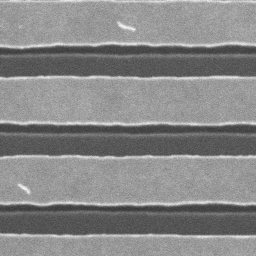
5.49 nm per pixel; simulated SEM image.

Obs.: lines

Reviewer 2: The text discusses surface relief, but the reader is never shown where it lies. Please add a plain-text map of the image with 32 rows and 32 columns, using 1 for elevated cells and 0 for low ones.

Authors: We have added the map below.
11111111111111111111111111111111
11111111111111111111111111111111
11111111111111111111111111111111
11111111111111111111111111111111
11111111111111111111111111111111
11111111111110011111111111110011
00000000000000000000000000000000
00000000000000000000000000000000
00000000000000000000000000000000
00000000000000000000000000000000
11111111111111111111111111111111
11111111111111111111111111111111
11111111111111111111111111111111
11111111111111111111111111111111
11111111111111111111111111111111
00000000000001111100000111110000
00000000000000000000000000000000
00000000000000000000000000000000
00000000000000000000000000000000
01111101111000000010011110011111
11111111111111111111111111111111
11111111111111111111111111111111
11111111111111111111111111111111
11111111111111111111111111111111
11111111111111111111111111111111
11001110011111111111111000000111
00000000000000000000000000000000
00000000000000000000000000000000
00000000000000000000000000000000
11111111101111111111111000000000
11111111111111111111111111111111
11111111111111111111111111111111